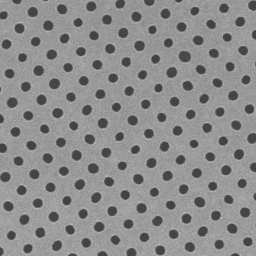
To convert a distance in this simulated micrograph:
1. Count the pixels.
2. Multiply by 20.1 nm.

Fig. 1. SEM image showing a regular array of holes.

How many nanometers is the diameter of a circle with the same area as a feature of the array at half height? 198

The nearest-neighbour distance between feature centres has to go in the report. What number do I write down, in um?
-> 0.411